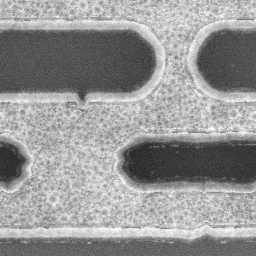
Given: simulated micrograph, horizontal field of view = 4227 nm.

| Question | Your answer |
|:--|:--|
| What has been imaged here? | one or a few lines or trenches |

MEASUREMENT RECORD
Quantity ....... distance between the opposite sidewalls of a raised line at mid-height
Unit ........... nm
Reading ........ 741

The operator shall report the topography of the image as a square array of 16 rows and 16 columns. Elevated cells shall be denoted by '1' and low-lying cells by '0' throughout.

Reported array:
1111111111111111
1111111111111100
0000000000110000
0000000000110000
0000000000110000
0000000001111000
1111111111111111
1111111111111111
1111111111111110
0011111100000000
0011111000000000
0111111100000000
1111111111111111
1111111111111111
1111111110110010
0000000000000000